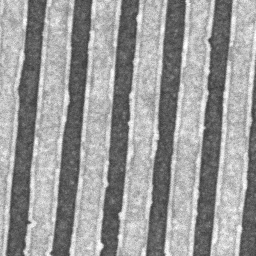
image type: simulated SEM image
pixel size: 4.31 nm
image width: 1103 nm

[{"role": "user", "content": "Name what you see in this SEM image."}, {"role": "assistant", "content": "parallel lines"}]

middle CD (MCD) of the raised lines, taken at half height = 118 nm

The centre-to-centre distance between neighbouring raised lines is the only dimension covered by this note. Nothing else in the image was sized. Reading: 200 nanometers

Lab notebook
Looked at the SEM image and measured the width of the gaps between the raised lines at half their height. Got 0.0842 µm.